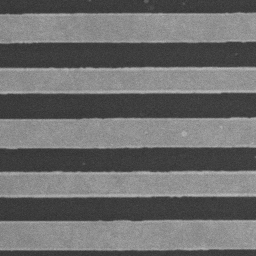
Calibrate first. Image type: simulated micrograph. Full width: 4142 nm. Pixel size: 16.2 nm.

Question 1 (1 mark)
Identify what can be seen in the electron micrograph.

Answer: lines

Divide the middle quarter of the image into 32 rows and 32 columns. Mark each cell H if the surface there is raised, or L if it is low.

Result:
LLLLLLLLLLLLLLLLLLLLLLLLLLLLLLLL
HHHHHHHHHHHHHHHHHHHHHHHHHHHHHHHH
HHHHHHHHHHHHHHHHHHHHHHHHHHHHHHHH
HHHHHHHHHHHHHHHHHHHHHHHHHHHHHHHH
HHHHHHHHHHHHHHHHHHHHHHHHHHHHHHHH
HHHHHHHHHHHHHHHHHHHHHHHHHHHHHHHH
HHHHHHHHHHHHHHHHHHHHHHHHHHHHHHHH
LLLLLLLLLLLLLLLLLLLLLLLLLLLLLLLL
LLLLLLLLLLLLLLLLLLLLLLLLLLLLLLLL
LLLLLLLLLLLLLLLLLLLLLLLLLLLLLLLL
LLLLLLLLLLLLLLLLLLLLLLLLLLLLLLLL
LLLLLLLLLLLLLLLLLLLLLLLLLLLLLLLL
LLLLLLLLLLLLLLLLLLLLLLLLLLLLLLLL
LLLLLLLLLLLLLLLLLLLLLLLLLLLLLLLL
HHHHHHHHHHHHHHHHHHHHHHHHHHHHHHHH
HHHHHHHHHHHHHHHHHHHHHHHHHHHHHHHH
HHHHHHHHHHHHHHHHHHHHHHHHHHHHHHHH
HHHHHHHHHHHHHHHHHHHHHHHHHHHHHHHH
HHHHHHHHHHHHHHHHHHHHHHHHHHHHHHHH
HHHHHHHHHHHHHHHHHHHHHHHHHHHHHHHH
HHHHHHHHHHHHHHHHHHHHHHHHHHHHHHHH
LLLLLLLLLLLLLLLLLLLLLLLLLLLLLLLL
LLLLLLLLLLLLLLLLLLLLLLLLLLLLLLLL
LLLLLLLLLLLLLLLLLLLLLLLLLLLLLLLL
LLLLLLLLLLLLLLLLLLLLLLLLLLLLLLLL
LLLLLLLLLLLLLLLLLLLLLLLLLLLLLLLL
LLLLLLLLLLLLLLLLLLLLLLLLLLLLLLLL
HHHHHHHHHHHHHHHHHHHHHHHHHHHHHHHH
HHHHHHHHHHHHHHHHHHHHHHHHHHHHHHHH
HHHHHHHHHHHHHHHHHHHHHHHHHHHHHHHH
HHHHHHHHHHHHHHHHHHHHHHHHHHHHHHHH
HHHHHHHHHHHHHHHHHHHHHHHHHHHHHHHH